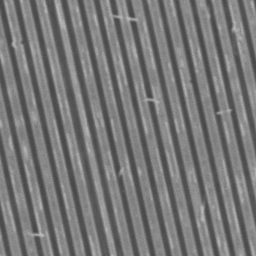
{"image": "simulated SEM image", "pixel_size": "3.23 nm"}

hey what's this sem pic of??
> parallel lines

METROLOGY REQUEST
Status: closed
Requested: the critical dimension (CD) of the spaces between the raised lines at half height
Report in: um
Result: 0.0225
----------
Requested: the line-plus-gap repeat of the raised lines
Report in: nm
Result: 50.4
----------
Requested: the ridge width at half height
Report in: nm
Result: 28.8